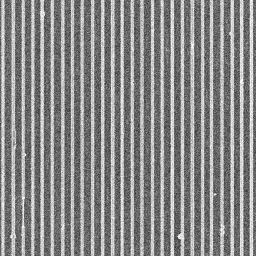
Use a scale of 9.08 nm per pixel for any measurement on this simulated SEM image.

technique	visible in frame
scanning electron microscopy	parallel lines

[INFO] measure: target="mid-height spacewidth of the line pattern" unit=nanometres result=63.5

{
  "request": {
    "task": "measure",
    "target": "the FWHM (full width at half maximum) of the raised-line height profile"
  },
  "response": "2.62 px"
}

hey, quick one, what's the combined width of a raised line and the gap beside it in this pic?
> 90.1 nanometers